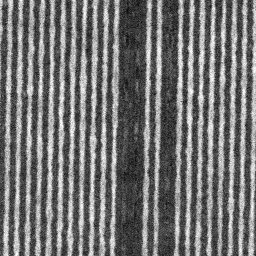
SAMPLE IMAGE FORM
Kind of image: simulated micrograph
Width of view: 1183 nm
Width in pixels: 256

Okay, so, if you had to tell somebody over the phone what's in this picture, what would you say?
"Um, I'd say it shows parallel lines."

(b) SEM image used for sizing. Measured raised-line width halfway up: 3.38 pixels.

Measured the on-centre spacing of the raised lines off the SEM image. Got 10.7 pixels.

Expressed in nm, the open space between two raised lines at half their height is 35.2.